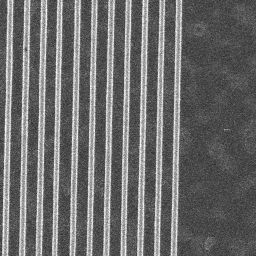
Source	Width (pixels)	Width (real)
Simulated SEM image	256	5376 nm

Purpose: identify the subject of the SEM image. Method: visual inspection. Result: parallel lines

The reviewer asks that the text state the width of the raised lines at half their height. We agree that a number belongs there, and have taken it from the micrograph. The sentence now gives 4.88 pixels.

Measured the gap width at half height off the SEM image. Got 247 nanometers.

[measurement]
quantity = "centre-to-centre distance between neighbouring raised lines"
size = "354 nanometers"